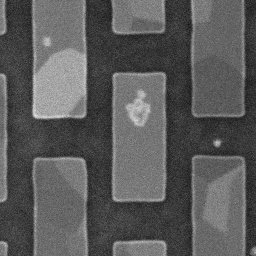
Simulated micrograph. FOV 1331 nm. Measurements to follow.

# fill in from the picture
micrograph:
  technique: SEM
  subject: groups of lines, slits or small figures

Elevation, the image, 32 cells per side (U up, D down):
UDDDUUUUUUUDDDUUUUUUDDDDUUUUUUDD
UDDDUUUUUUUDDDUUUUUUDDDDUUUUUUDD
UDDDUUUUUUUDDDUUUUUUDDDDUUUUUUDD
UDDDUUUUUUUDDDUUUUUUDDDDUUUUUUDD
DDDDUUUUUUUDDDDDDDDDDDDDUUUUUUDD
DDDDUUUUUUUDDDDDDDDDDDDDUUUUUUDD
DDDDUUUUUUUDDDDDDDDDDDDDUUUUUUDD
DDDDUUUUUUUDDDDDDDDDDDDDUUUUUUDD
DDDDUUUUUUUDDDDDDDDDDDDDUUUUUUDD
DDDDUUUUUUUDDDUUUUUUDDDDUUUUUUDD
UDDDUUUUUUUDDDUUUUUUUDDDUUUUUUDD
UDDDUUUUUUUDDDUUUUUUUDDDUUUUUUDD
UDDDUUUUUUUDDDUUUUUUUDDDUUUUUUDD
UDDDUUUUUUUDDDUUUUUUUDDDUUUUUUDD
UDDDDUUUUUDDDDUUUUUUUDDDDDDDDDDD
UDDDDDDDDDDDDDUUUUUUUDDDDDDDDDDD
UDDDDDDDDDDDDDUUUUUUUDDDDDDDDDDD
UDDDDDDDDDDDDDUUUUUUUDDDDDDDDDDD
UDDDDDDDDDDDDDUUUUUUUDDDDDDDDDDD
UDDDDDDDDDDDDDUUUUUUUDDDDDDDDDDD
UDDDUUUUUUUDDDUUUUUUUDDDUUUUUUUD
UDDDUUUUUUUDDDUUUUUUUDDDUUUUUUUD
UDDDUUUUUUUDDDUUUUUUUDDDUUUUUUUD
UDDDUUUUUUUDDDUUUUUUUDDDUUUUUUUD
UDDDUUUUUUUDDDUUUUUUUDDDUUUUUUUD
DDDDDUUUUUUDDDDDDDDDDDDDUUUUUUUD
DDDDUUUUUUUDDDDDDDDDDDDDUUUUUUUD
DDDDUUUUUUUDDDDDDDDDDDDDUUUUUUUD
DDDDUUUUUUUDDDDDDDDDDDDDUUUUUUUD
DDDDUUUUUUUDDDDDDDDDDDDDUUUUUUUD
UDDDUUUUUUUDDDDUUUUUUDDDUUUUUUUD
UDDDUUUUUUUDDDUUUUUUUDDDUUUUUUUD